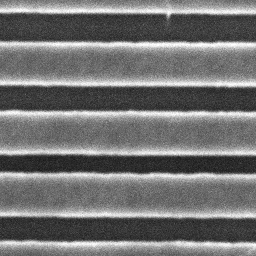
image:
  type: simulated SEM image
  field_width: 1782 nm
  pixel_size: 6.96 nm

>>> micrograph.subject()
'lines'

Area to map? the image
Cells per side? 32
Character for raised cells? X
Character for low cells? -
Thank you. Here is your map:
XXXXXXXXXXXXXXXXXXXXXXXXXXXXXXXX
------------------XXXXXXXXXXXXXX
--------------------------------
--------------------------------
--------------------------------
XXXXXXXXXXXXXXXXXXXXXXXXXXXXXXXX
XXXXXXXXXXXXXXXXXXXXXXXXXXXXXXXX
XXXXXXXXXXXXXXXXXXXXXXXXXXXXXXXX
XXXXXXXXXXXXXXXXXXXXXXXXXXXXXXXX
XXXXXXXXXXXXXXXXXXXXXXXXXXXXXXXX
-XXXXXXXXXXXXXXXXXXXXXXXXXXXXXXX
--------------------------------
--------------------------------
--------------------------------
XXXXXXXXXXXXXXXXXXXXXXXXXXXXXXXX
XXXXXXXXXXXXXXXXXXXXXXXXXXXXXXXX
XXXXXXXXXXXXXXXXXXXXXXXXXXXXXXXX
XXXXXXXXXXXXXXXXXXXXXXXXXXXXXXXX
XXXXXXXXXXXXXXXXXXXXXXXXXXXXXXXX
--------------------------------
--------------------------------
--------------------------------
XXXXXXXXXXXXXXXXXXXXXXXXXXXXXXXX
XXXXXXXXXXXXXXXXXXXXXXXXXXXXXXXX
XXXXXXXXXXXXXXXXXXXXXXXXXXXXXXXX
XXXXXXXXXXXXXXXXXXXXXXXXXXXXXXXX
XXXXXXXXXXXXXXXXXXXXXXXXXXXXXXXX
--------------------------------
--------------------------------
--------------------------------
XXXXXXXXXXXXXXXXXXXXXXXXXXXXXXXX
XXXXXXXXXXXXXXXXXXXXXXXXXXXXXXXX